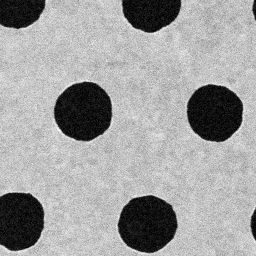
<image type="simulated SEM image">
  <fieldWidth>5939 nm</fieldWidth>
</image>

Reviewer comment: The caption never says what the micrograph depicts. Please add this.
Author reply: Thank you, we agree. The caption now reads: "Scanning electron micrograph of holes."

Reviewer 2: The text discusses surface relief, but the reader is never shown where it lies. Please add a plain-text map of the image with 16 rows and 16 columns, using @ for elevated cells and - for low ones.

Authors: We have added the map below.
---@@@@@---@@@@@
--@@@@@@---@@@@@
@@@@@@@@@@@@@@@@
@@@@@@@@@@@@@@@@
@@@@@@@@@@@@@@@@
@@@@--@@@@@@--@@
@@@----@@@@@---@
@@@----@@@@@---@
@@@@--@@@@@@--@@
@@@@@@@@@@@@@@@@
@@@@@@@@@@@@@@@@
@@@@@@@@@@@@@@@@
--@@@@@@--@@@@@@
---@@@@----@@@@@
---@@@@----@@@@@
--@@@@@@--@@@@@@